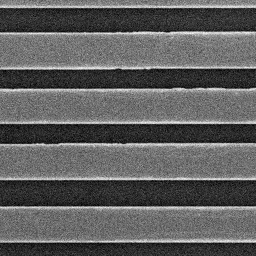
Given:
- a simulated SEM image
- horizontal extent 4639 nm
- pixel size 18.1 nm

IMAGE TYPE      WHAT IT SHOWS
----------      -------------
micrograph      lines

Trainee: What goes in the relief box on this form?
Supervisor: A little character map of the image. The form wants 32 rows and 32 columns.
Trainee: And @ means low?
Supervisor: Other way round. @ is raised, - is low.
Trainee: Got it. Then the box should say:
@@@@@@@@@@@@@@@@@@@@@@@@@@@@@@@@
--------------------------------
--------------------------------
--------------------------------
@@@@@@@@@@@@@@@@@@@@@@@@@@@@@@@@
@@@@@@@@@@@@@@@@@@@@@@@@@@@@@@@@
@@@@@@@@@@@@@@@@@@@@@@@@@@@@@@@@
@@@@@@@@@@@@@@@@@@@@@@@@@@@@@@@@
@@@@@@--------------------------
--------------------------------
--------------------------------
@@@@@@@@@@@@@@@@@@@@@@@@@@@@@@@@
@@@@@@@@@@@@@@@@@@@@@@@@@@@@@@@@
@@@@@@@@@@@@@@@@@@@@@@@@@@@@@@@@
@@@@@@@@@@@@@@@@@@@@@@@@@@@@@@@@
--------------------------------
--------------------------------
--------------------------------
@@@@@@@@@@@@@@@@@@@@@@@@@@@@@@@@
@@@@@@@@@@@@@@@@@@@@@@@@@@@@@@@@
@@@@@@@@@@@@@@@@@@@@@@@@@@@@@@@@
@@@@@@@@@@@@@@@@@@@@@@@@@@@@@@@@
--------------------------------
--------------------------------
--------------------------------
--------------------------------
@@@@@@@@@@@@@@@@@@@@@@@@@@@@@@@@
@@@@@@@@@@@@@@@@@@@@@@@@@@@@@@@@
@@@@@@@@@@@@@@@@@@@@@@@@@@@@@@@@
@@@@@@@@@@@@@@@@@@@@@@@@@@@@@@@@
--------------------------------
--------------------------------